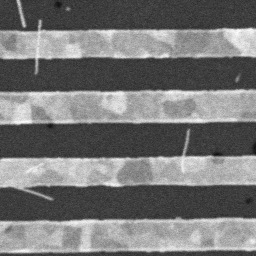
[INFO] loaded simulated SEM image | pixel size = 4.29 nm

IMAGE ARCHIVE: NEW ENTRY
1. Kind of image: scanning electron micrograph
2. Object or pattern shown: lines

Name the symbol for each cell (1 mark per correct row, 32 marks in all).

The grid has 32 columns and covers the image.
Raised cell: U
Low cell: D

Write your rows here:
DDDDDDDDDDDDDDDDDDDDDDDDDDDDDDDD
DDDDDDDDDDDDDDDDDDDDDDDDDDDDDDDD
DDDDDDDDDDDDDDDDDDDDDDDDDDDDDDDD
DDDDDDDDDDDDDDDDDDDDDDDDDDDDDDDD
UUUUUUUUUUUUUUUUUUUUUUUUUUUUUUUU
UUUUUUUUUUUUUUUUUUUUUUUUUUUUUUUU
UUUUUUUUUUUUUUUUUUUUUUUUUUUUUUUU
DDDDDDDDDDDDDDDDDDDDDDDDDDDDDDDD
DDDDDDDDDDDDDDDDDDDDDDDDDDDDDDDD
DDDDDDDDDDDDDDDDDDDDDDDDDDDDDDDD
DDDDDDDDDDDDDDDDDDDDDDDDDDDDDDDD
DDDDDDDDDDDDDDDDDDDDDUDDDDDDDUUU
UUUUUUUUUUUUUUUUUUUUUUUUUUUUUUUU
UUUUUUUUUUUUUUUUUUUUUUUUUUUUUUUU
UUUUUUUUUUUUUUUUUUUUUUUUUUUUUUUU
DDDDDDDDDDDDDDDDDDDDDDDDDDDDDDDD
DDDDDDDDDDDDDDDDDDDDDDDDDDDDDDDD
DDDDDDDDDDDDDDDDDDDDDDDDDDDDDDDD
DDDDDDDDDDDDDDDDDDDDDDDDDDDDDDDD
DDDDDDDDDDDDDDDDDDDDDDDDDDDDDDDD
UUUUUUUUUUUUUUUUUUUUUUUUUUUUUUUU
UUUUUUUUUUUUUUUUUUUUUUUUUUUUUUUU
UUUUUUUUUUUUUUUUUUUUUUUUUUUUUUUU
DDDDDDDDDDDDDDDDDDDDDDDDDDDDDDDD
DDDDDDDDDDDDDDDDDDDDDDDDDDDDDDDD
DDDDDDDDDDDDDDDDDDDDDDDDDDDDDDDD
DDDDDDDDDDDDDDDDDDDDDDDDDDDDDDDD
DDDDDDDDDDDDDDDDDDDDDDUDDDDDUDDD
UUUUUUUUUUUUUUUUUUUUUUUUUUUUUUUU
UUUUUUUUUUUUUUUUUUUUUUUUUUUUUUUU
UUUUUUUUUUUUUUUUUUUUUUUUUUUUUUUU
DDDDDDDDDDDDDDDDDDDDDDDDDDDDDDDD